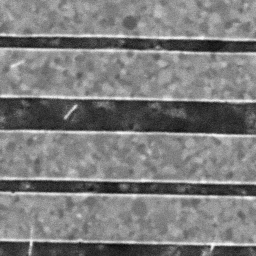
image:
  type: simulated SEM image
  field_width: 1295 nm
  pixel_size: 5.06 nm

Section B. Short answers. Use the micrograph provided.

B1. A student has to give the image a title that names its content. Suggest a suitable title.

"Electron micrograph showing one or a few lines or trenches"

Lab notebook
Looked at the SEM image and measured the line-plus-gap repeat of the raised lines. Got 364 nm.